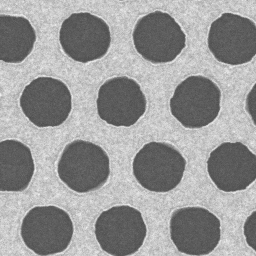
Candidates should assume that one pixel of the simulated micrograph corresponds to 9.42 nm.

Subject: holes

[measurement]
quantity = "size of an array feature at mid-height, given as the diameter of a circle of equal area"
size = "483 nm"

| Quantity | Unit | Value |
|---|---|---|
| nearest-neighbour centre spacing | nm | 700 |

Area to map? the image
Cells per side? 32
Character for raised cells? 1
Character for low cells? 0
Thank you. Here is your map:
11111111111111111111111111111111
11111111111111111110111111111111
00011111000001111100001111100001
00001111000000111000000111000000
00001110000000111000000111000000
00001111000000111000000111000000
00001111000001111000000111000000
00011111100011111100001111100001
11111111111111111111111111111111
11111111111111111111111101111111
11110000111110000111111000011111
11100000011100000011110000001110
11100000011100000011100000001110
11100000011100000011100000011110
11100000011100000011110000011110
11110000111111000111111000111111
11111111111111111111111111111111
11111111111111111111111111111111
00011111000001111100001111100001
00001111000001111000000111000000
00001110000000111000000111000000
00001110000000111000000111000000
00001111000001111000000111100000
00011111100011111100001111100001
11111111111111111111111111111111
11111111111111111111111111111111
11110000111110000111110000111111
11100000011100000011100000011110
11100000011100000011100000001100
11100000011100000011100000001110
11100000011100000011110000011110
11110001111110000111111000111111